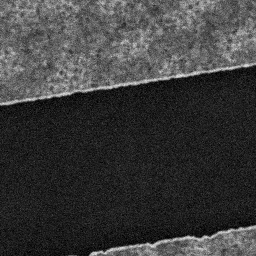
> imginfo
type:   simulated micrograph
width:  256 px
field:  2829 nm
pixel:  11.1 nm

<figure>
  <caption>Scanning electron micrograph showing one or a few lines or trenches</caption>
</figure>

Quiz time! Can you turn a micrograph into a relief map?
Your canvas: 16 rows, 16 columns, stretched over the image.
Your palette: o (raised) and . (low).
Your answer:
oooooooooooooooo
oooooooooooooooo
oooooooooooooooo
oooooooooooooooo
ooooooooooooo...
oooooo..........
................
................
................
................
................
................
................
................
..............oo
........oooooooo